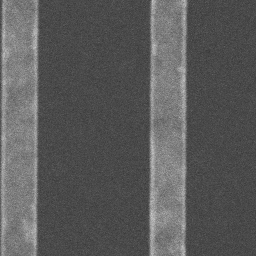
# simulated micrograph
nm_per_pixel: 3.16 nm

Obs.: one or a few lines or trenches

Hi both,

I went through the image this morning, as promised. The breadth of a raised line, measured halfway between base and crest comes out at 105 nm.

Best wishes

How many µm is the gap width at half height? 0.367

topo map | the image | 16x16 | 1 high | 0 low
1100000000110000
1100000000110000
1000000000110000
1100000000110000
1100000000110000
1100000000110000
1100000000110000
1100000000110000
1100000000110000
1100000000110000
1100000001110000
1100000001100000
1100000001100000
1100000001110000
1100000001100000
1100000001110000